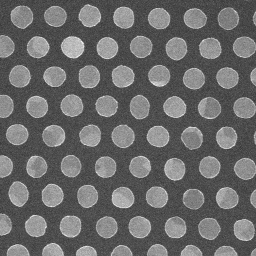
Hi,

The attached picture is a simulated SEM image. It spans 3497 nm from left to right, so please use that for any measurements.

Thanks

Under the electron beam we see a regular array of raised bodies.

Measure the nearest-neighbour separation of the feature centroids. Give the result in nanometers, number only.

458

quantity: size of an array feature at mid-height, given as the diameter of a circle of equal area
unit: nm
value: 292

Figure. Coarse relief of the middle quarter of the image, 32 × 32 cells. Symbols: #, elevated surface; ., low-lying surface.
..............#........##.......
....####.....####.....####.....#
....#####...#####....#####....##
....#####...#####....#####....##
....#####...#####.....####....##
.....###.....###...............#
................................
................................
####.....###.....###.......##...
####....#####....####....#####..
#####...#####....####....#####..
#####...#####....####....#####..
####.....###.....####.....####..
..................##............
................................
......##......##................
....#####....####....#####....##
....#####...#####....#####....##
....#####...#####....#####...###
....#####...#####....#####....##
.......#......##.......##......#
................................
................................
###......###......##............
####....#####....####.....####..
####....#####...#####....#####..
####....#####...#####....#####..
###.....####.....####....#####..
..........................###...
................................
.....##.........................
....####.....###.....####......#